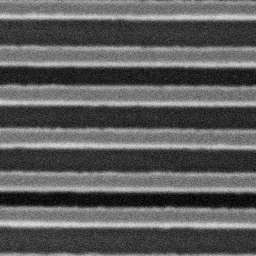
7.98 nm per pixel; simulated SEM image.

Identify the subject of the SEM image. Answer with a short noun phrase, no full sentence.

lines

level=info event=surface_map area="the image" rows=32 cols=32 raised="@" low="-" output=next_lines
@@@@@@@@@@@@@@@@@@@@@@@@@@@@@@@@
@@@@@@@@@@@@@@@@@@@@@@@@@@@@@@@@
--------------------------------
--------------------------------
--------------------------------
--------------------------------
@@@@@@@@@@@@@@@@@@@@@@@@@@@@@@@@
@@@@@@@@@@@@@@@@@@@@@@@@@@@@@@@@
--------------------------------
--------------------------------
--------------------------------
@@@@@@@@@@@@@@@@@@@@@@@@@@@@@@@@
@@@@@@@@@@@@@@@@@@@@@@@@@@@@@@@@
--------------------------------
--------------------------------
--------------------------------
@@@@@@@@@@@@@@@@@@@@@@@@@@@@@@@@
@@@@@@@@@@@@@@@@@@@@@@@@@@@@@@@@
-----------------------------@-@
--------------------------------
--------------------------------
--------------------------------
@@@@@@@@@@@@@@@@@@@@@@@@@@@@@@@@
@@@@@@@@@@@@@@@@@@@@@@@@@@@@@@@@
--------------------------------
--------------------------------
@@@@@@@@@@@@@@@@@@@@@@@@@@@@@@@@
@@@@@@@@@@@@@@@@@@@@@@@@@@@@@@@@
--------------------------------
--------------------------------
--------------------------------
--------------------------------